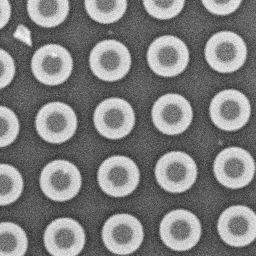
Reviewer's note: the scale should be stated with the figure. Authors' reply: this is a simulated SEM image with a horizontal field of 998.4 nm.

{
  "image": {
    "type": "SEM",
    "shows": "an array of small figures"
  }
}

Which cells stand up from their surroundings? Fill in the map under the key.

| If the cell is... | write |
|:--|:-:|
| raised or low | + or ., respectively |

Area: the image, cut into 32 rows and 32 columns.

+..++++++..+++++..+++++..+++++..
+...++++...++++....+++....+++...
+...++++....+++.................
..+.............................
..++.......................+++..
............+++....++++...+++++.
+....+++...+++++..+++++...+++++.
++..+++++..+++++..+++++...+++++.
++..+++++..+++++...++++....+++..
++..+++++...+++.....+...........
+.....+.........................
............................++..
.............++.....+++....++++.
+....++++...++++...+++++..+++++.
++...++++...+++++..+++++..+++++.
++...+++++..+++++..+++++...++++.
++...++++...++++....+++.........
++....++........................
.............................+..
....................++++...++++.
......+++....++++...++++...+++++
++...+++++..+++++..++++++..+++++
+++..+++++..+++++...++++...++++.
+++..+++++...++++...++++........
++....+++.....+.................
+...............................
.....................+++....++++
.......++.....+++...+++++..+++++
+++...++++...+++++..+++++..+++++
+++...+++++..+++++..+++++...++++
+++...++++...+++++...+++.....++.
+++...++++....+++...............